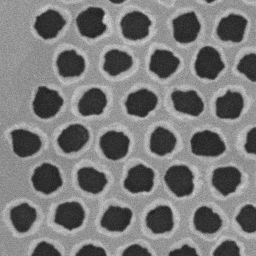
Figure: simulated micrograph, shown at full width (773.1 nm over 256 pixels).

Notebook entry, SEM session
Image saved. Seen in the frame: a regular array of holes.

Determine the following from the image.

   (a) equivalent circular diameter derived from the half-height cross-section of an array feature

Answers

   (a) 0.0989 µm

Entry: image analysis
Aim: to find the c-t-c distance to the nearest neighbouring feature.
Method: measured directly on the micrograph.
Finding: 126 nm